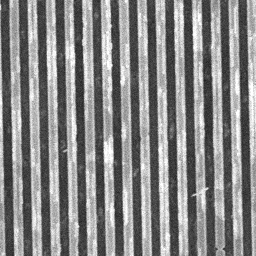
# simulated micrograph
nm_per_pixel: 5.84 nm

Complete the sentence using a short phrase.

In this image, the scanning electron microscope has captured parallel lines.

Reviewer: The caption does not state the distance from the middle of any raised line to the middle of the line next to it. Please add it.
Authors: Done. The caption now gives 107 nm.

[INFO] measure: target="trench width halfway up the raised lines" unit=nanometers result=59.8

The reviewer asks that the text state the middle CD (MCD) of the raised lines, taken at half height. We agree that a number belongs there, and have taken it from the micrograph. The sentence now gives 44.5 nanometres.